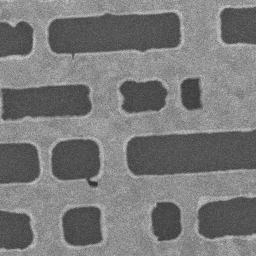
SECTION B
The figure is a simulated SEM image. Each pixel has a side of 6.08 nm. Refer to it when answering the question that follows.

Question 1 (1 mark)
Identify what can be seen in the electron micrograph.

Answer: one or a few lines or trenches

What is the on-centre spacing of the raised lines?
383 nanometres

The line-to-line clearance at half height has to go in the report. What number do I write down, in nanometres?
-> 234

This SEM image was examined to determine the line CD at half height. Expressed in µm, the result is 0.162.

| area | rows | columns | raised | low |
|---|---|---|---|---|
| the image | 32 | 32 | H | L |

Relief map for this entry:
HHHHHHHHHHHHHHHHHHHHHHHHHHHHHHHH
HHHHHHHHHHHHHHHHHHHHLLHHHHHHLLLL
HHHHHHHLLLLLLLLLLLLLLLLHHHHLLLLL
LLLLHHLLLLLLLLLLLLLLLLLHHHHLLLLL
LLLLHHLLLLLLLLLLLLLLLLLHHHHLLLLL
LLLLHHLLLLLLLLLLLLLLLLLHHHHHLLLL
LLLLHHHLLLLLLLLHHLHHHHHHHHHHHHHH
HHHHHHHHHHHHHHHHHHHHHHHHHHHHHHHH
HHHHHHHHHHHHHHHHHHHHHHHHHHHHHHHH
HHHHHHHHHHHHHHHHHHHHHHHHHHHHHHHH
HHHHHHHHLLHHHHHLLLLLLHHLLHHHHHHH
LLLLLLLLLLLHHHHLLLLLLHLLLHHHHHHH
LLLLLLLLLLLHHHHLLLLLLHLLLHHHHHHH
LLLLLLLLLLLHHHHLLLLLHHHLLHHHHHHH
LLLLLLLLLLLHHHHHHHHHHHHHHHHHHHHH
HHHHHHHHHHHHHHHHHHHHHHHHHHHHHHHH
HHHHHHHHHHHHHHHHHHHHHHLLLLLLLLLL
HHHHHHHHLLLLHHHHLLLLLLLLLLLLLLLL
LLLLLHLLLLLLLHHHLLLLLLLLLLLLLLLL
LLLLLHLLLLLLLHHHLLLLLLLLLLLLLLLL
LLLLLHLLLLLLLHHHLLLLLLLLLLLLLLLL
LLLLLHLLLLLLLHHHLLLLLLLLLLLLHHHH
LLLLLHHLLLLLHHHHHHHHHHHHHHHHHHHH
HHHHHHHHHHHHHHHHHHHHHHHHHHHHHHHH
HHHHHHHHHHHHHHHHHHHHHHHHHHHHHHLH
HHHHHHHHHHHHHHHHHHHLLLHHHLLLLLLL
LLLHHHHHLLLLLHHHHHHLLLLHHLLLLLLL
LLLLHHHHLLLLLHHHHHHLLLLHHLLLLLLL
LLLLHHHHLLLLLHHHHHHLLLLHHLLLLLLL
LLLLHHHHLLLLLHHHHHHLLLLHHLLLLLLL
LLLLHHHHLLLLHHHHHHHHHHHHHHHHHHHH
HHHHHHHHHHHHHHHHHHHHHHHHHHHHHHHH